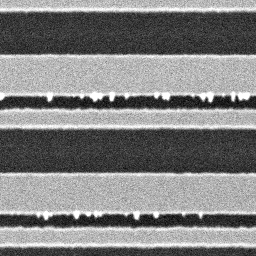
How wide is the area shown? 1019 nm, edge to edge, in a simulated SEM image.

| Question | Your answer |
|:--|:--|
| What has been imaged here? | lines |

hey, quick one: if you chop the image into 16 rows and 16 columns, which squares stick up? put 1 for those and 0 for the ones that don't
1111111111111111
0000000000000000
0000000000000000
1111111111111111
1111111111111111
1111111111111111
1111111111111111
1111111111111111
0000000000000000
0000000000000000
0000000000000000
1111111111111111
1111111111111111
1111111111111111
1111111111111111
0000000000000000